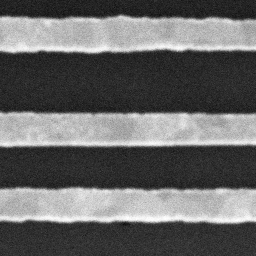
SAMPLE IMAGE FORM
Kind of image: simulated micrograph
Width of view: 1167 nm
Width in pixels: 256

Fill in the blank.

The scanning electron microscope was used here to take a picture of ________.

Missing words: lines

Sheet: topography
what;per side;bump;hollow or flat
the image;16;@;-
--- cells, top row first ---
----------------
@@@@@@@@@@@@@@@@
@@@@@@@@@@@@@@@@
----------------
----------------
----------------
----------------
@@@@@@@@@@@@@@@@
@@@@@@@@@@@@@@@@
----------------
----------------
----------------
@@@@@@@@@@@@@@@@
@@@@@@@@@@@@@@@@
----------------
----------------